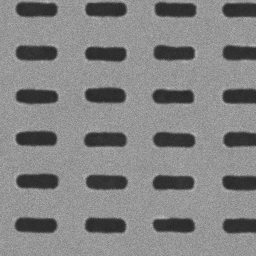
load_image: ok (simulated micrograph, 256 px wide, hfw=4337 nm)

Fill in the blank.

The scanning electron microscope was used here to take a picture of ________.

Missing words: a regular array of holes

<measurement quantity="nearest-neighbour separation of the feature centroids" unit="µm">0.727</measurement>